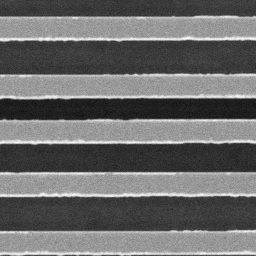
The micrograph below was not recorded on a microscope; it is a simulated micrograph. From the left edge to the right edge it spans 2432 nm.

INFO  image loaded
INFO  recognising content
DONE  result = lines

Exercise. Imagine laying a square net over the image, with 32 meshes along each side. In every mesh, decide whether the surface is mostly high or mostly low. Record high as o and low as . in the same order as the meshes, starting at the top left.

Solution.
................................
................................
oooooooooooooooooooooooooooooooo
oooooooooooooooooooooooooooooooo
oooooooooooooooooooooooooooooooo
................................
................................
................................
................................
oooooooooooooooooooooooooooooooo
oooooooooooooooooooooooooooooooo
oooooooooooooooooooooooooooooooo
................................
................................
................................
oooooooooooooooooooooooooooooooo
oooooooooooooooooooooooooooooooo
oooooooooooooooooooooooooooooooo
................................
................................
................................
................................
oooooooooooooooooooooooooooooooo
oooooooooooooooooooooooooooooooo
oooooooooooooooooo.....ooo...o.o
................................
................................
................................
................................
oooooooooooooooooooooooooooooooo
oooooooooooooooooooooooooooooooo
oooooooooooooooooooooooooooooooo